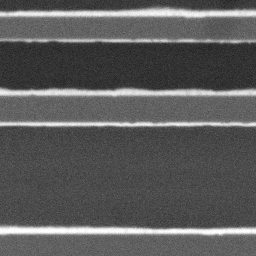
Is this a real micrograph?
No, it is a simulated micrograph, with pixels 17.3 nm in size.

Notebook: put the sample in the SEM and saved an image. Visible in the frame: lines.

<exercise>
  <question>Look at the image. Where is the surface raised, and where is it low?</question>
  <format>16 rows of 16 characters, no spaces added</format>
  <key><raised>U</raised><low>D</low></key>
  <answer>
DDDDDDDDDDDDDDDD
UUUUUUUUUUUUUUUU
UUUUUUUUUUUUUUUU
DDDDDDDDDDDDDDDD
DDDDDDDDDDDDDDDD
DDDDDDDDDDDDDDDD
UUUUUUUUUUUUUUUU
UUUUUUUUUUUUUUUU
DDDDDDDDDDDDDDDD
DDDDDDDDDDDDDDDD
DDDDDDDDDDDDDDDD
DDDDDDDDDDDDDDDD
DDDDDDDDDDDDDDDD
DDDDDDDDDDDDDDDD
DDDDDDDDDDDDDDDD
UUUUUUUUUUUUUUUU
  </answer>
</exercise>